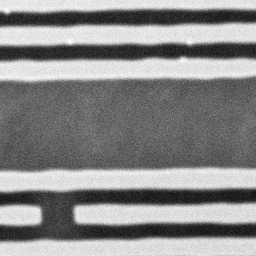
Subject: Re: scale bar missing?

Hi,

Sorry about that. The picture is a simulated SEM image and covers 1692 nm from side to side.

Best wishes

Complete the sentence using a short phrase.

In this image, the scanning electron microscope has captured groups of lines, slits or small figures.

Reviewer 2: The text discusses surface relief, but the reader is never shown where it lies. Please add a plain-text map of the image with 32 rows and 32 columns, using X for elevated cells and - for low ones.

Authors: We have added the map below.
XXXXXXXXXXXXXXXXXXXXXXXXXXXXXXXX
--------------------------------
--------------------------------
XXXXXXXXXXXXXXXXXXXXXXXXXXXXXXXX
XXXXXXXXXXXXXXXXXXXXXXXXXXXXXXXX
XXXXXXXX------------------------
--------------------------------
------------------XXX-XXXXX--XXX
XXXXXXXXXXXXXXXXXXXXXXXXXXXXXXXX
XXXXXXXXXXXXXXXXXXXXXXXXXXXXXXX-
--------------------------------
--------------------------------
--------------------------------
--------------------------------
--------------------------------
--------------------------------
--------------------------------
--------------------------------
--------------------------------
--------------------------------
--------------------------------
------XXX-XXXXXXXXXXXXXXXXXXXXXX
XXXXXXXXXXXXXXXXXXXXXXXXXXXXXXXX
XXXXXXXXXXXXXXXXXX-XXXXXXXXX----
--------------------------------
--------------------------------
XXXXX----XXXXXXXXXXXXXXXXXXXXXXX
XXXXX-----XXXXXXXXXXXXXXXXXXXXXX
--------------------------------
--------------------------------
XXXXXXXXXXXXXXXXXXXXXXXXXXXXXXXX
XXXXXXXXXXXXXXXXXXXXXXXXXXXXXXXX